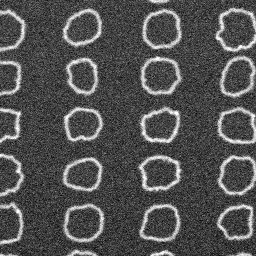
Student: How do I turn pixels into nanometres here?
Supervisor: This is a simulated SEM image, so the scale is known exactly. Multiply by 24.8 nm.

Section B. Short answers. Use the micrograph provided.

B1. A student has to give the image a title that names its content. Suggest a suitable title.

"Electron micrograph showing a regular array of raised bodies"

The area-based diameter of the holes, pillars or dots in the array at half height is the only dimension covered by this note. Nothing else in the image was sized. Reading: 848 nanometres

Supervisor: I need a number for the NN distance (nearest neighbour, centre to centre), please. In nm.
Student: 1200